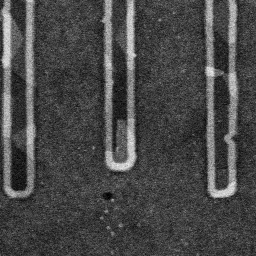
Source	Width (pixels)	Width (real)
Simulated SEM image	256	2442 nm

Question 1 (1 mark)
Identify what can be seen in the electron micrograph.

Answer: one or a few lines or trenches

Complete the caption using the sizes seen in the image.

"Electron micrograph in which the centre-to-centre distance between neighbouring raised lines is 0.967 µm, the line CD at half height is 216 nm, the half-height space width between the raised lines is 754 nm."